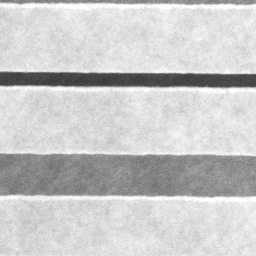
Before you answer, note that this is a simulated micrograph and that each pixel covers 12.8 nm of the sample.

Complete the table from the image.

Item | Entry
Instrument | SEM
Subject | lines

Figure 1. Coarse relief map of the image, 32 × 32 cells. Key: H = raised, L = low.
HHHHHHHHHHHHHHLLLLLLLLLLLLLLLLLL
HHHHHHHHHHHHHHHHHHHHHHHHHHHHHHHH
HHHHHHHHHHHHHHHHHHHHHHHHHHHHHHHH
HHHHHHHHHHHHHHHHHHHHHHHHHHHHHHHH
HHHHHHHHHHHHHHHHHHHHHHHHHHHHHHHH
HHHHHHHHHHHHHHHHHHHHHHHHHHHHHHHH
HHHHHHHHHHHHHHHHHHHHHHHHHHHHHHHH
HHHHHHHHHHHHHHHHHHHHHHHHHHHHHHHH
HHHHHHHHHHHHHHHHHHHHHHHHHHHHHHHH
LLLLLLLLLLLLLLLLLLLLLLLLLLLLLLLL
LLLLLLLLLLLLLLLLLLLLLLLLLLLLLLLL
HHHHHHHHHHHHHHHHHHHHHHHHHHHHHHHH
HHHHHHHHHHHHHHHHHHHHHHHHHHHHHHHH
HHHHHHHHHHHHHHHHHHHHHHHHHHHHHHHH
HHHHHHHHHHHHHHHHHHHHHHHHHHHHHHHH
HHHHHHHHHHHHHHHHHHHHHHHHHHHHHHHH
HHHHHHHHHHHHHHHHHHHHHHHHHHHHHHHH
HHHHHHHHHHHHHHHHHHHHHHHHHHHHHHHH
HHHHHHHHHHHHHHHHHHHHHHHHHHHHHHHH
LLLLLLLLLLLLLLLLLLLLLLLLLLLLLLLL
LLLLLLLLLLLLLLLLLLLLLLLLLLLLLLLL
LLLLLLLLLLLLLLLLLLLLLLLLLLLLLLLL
LLLLLLLLLLLLLLLLLLLLLLLLLLLLLLLL
LLLLLLLLLLLLLLLLLLLLLLLLLLLLLLLL
LHHLHHLLLLLLLLLLLLLLLLLLLLLLLLLL
HHHHHHHHHHHHHHHHHHHHHHHHHHHHHHHH
HHHHHHHHHHHHHHHHHHHHHHHHHHHHHHHH
HHHHHHHHHHHHHHHHHHHHHHHHHHHHHHHH
HHHHHHHHHHHHHHHHHHHHHHHHHHHHHHHH
HHHHHHHHHHHHHHHHHHHHHHHHHHHHHHHH
HHHHHHHHHHHHHHHHHHHHHHHHHHHHHHHH
HHHHHHHHHHHHHHHHHHHHHHHHHHHHHHHH